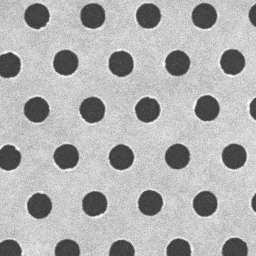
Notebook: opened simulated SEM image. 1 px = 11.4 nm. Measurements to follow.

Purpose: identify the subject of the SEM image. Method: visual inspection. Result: a regular array of holes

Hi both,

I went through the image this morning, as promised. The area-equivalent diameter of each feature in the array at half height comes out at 25.9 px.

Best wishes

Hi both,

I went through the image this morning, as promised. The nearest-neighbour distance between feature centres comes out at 0.615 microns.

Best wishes